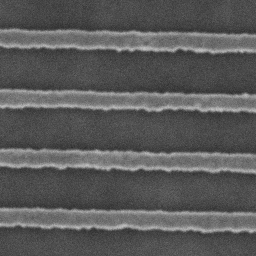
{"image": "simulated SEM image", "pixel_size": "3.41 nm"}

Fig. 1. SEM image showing lines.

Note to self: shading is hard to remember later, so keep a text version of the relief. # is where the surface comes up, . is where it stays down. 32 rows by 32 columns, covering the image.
................................
................................
................................
................................
################################
################################
..........................##....
................................
................................
................................
................................
##########.#....................
################################
..#.......######################
................................
................................
................................
................................
................................
################################
################################
..........................#...##
................................
................................
................................
................................
#####################...........
################################
.........##.###..###############
................................
................................
................................